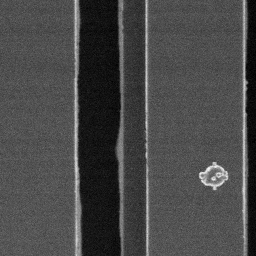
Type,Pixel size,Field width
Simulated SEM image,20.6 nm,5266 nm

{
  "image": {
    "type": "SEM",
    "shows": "lines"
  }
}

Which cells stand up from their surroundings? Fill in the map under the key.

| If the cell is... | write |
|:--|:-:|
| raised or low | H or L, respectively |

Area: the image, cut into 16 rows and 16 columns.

HHHHHLLLHHHHHHHL
HHHHHLLLHHHHHHHL
HHHHHLLLHHHHHHHL
HHHHHLLLHHHHHHHL
HHHHHLLLHHHHHHHL
HHHHHLLLHHHHHHHL
HHHHHLLLHHHHHHHL
HHHHHLLLHHHHHHHL
HHHHHLLLHHHHHHHL
HHHHHLLLHHHHHHHL
HHHHHLLLHHHHHHHL
HHHHHLLLHHHHHHHL
HHHHHLLLHHHHHHHL
HHHHHLLLHHHHHHHL
HHHHHLLLHHHHHHHL
HHHHHLLLHHHHHHHL